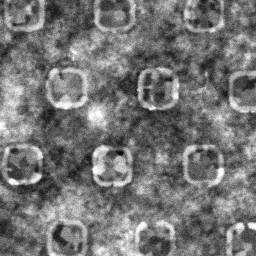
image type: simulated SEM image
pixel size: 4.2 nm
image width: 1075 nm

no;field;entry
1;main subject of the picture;raised bodies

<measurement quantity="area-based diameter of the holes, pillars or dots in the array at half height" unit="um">0.165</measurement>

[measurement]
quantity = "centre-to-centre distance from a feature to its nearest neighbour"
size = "373 nm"